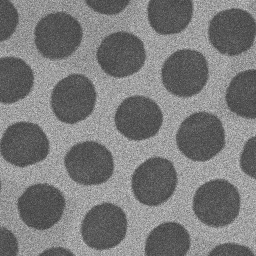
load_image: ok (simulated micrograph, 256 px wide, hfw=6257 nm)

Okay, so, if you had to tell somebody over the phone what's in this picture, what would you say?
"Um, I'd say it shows a regular array of holes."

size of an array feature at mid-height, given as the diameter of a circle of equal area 1170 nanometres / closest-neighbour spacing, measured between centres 1590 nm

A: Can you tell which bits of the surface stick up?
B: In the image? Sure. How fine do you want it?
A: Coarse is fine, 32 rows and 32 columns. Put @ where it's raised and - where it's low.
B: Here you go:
--@@@@@@@@@-----@@@-----@@@@@@@@
--@@@@@@@@@@---@@@------@@@----@
--@@@-----@@@@@@@@@-----@@------
--@@------@@@@@@@@@----@@@------
-@@@------@@@----@@@@@@@@@------
@@@@------@@@-----@@@@@@@@------
@@@@@----@@@------@@@@---@@----@
---@@@@@@@@@------@@@-----@@@@@@
----@@@@@@@@@-----@@------@@@@@@
----@@@@---@@@--@@@@------@@@---
----@@@-----@@@@@@@@------@@@---
----@@@-----@@@@@@@@@----@@@----
---@@@------@@@----@@@@@@@@@----
@@@@@@@-----@@@-----@@@@@@@@@---
@@@@@@@----@@@------@@@@---@@@--
@---@@@@-@@@@@------@@@-----@@@@
@----@@@@@@@@@@-----@@------@@@@
------@@@@@@@@@@--@@@@------@@@-
------@@@----@@@@@@@@@------@@--
------@@------@@@@@@@@@----@@@--
@---@@@@------@@@@----@@@@@@@@--
@@@@@@@@------@@@-----@@@@@@@@--
@@@@@@@@@----@@@------@@@@@-@@@@
@@@----@@@@@@@@@------@@@----@@@
@@@-----@@@@@@@@@----@@@------@@
@@------@@@@--@@@@--@@@@------@@
@@------@@@-----@@@@@@@@------@@
@@@----@@@------@@@@@@@@@----@@@
-@@@--@@@@------@@@----@@@@@@@@@
--@@@@@@@@------@@------@@@@@@@@
--@@@@@@@@@----@@@------@@@@-@@@
--@@@----@@@@@@@@@-----@@@------